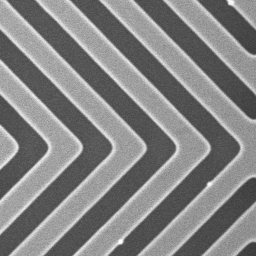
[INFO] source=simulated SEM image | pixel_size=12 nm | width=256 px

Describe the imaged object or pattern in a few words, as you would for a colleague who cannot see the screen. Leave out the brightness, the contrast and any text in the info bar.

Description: groups of lines, slits or small figures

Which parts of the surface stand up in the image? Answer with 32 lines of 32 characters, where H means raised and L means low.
HLLLLHHHHLLLLHHHHLLLLHHHHLLLLHHH
HHLLLLHHHHLLLLHHHHLLLLHHHHLLLLHH
HHHLLLLHHHHLLLLHHHHLLLLHHHHLLLLH
HHHHLLLLHHHHLLLLHHHHLLLLHHHHLLLL
LHHHHLLLLHHHHLLLLHHHHLLLLHHHHLLL
LLHHHHLLLLHHHHLLLLHHHHLLLLHHHHLL
LLLHHHHLLLLHHHHLLLLHHHHLLLLHHHHL
LLLLHHHHLLLLHHHHLLLLHHHHLLLLHHHH
HLLLLHHHHLLLLHHHHLLLLHHHHLLLLHHH
HHLLLLHHHHLLLLHHHHLLLLHHHHLLLLHH
HHHLLLLHHHHLLLLHHHHLLLLHHHHLLLLH
HHHHLLLLHHHHLLLLHHHHLLLLHHHHLLLL
LHHHHLLLLHHHHLLLLHHHHLLLLHHHHLLL
LLHHHHLLLLHHHHLLLLHHHHLLLLHHHHLL
LLLHHHHLLLLHHHHLLLLHHHHLLLLHHHHL
LLLLHHHHLLLLHHHHLLLLHHHHLLLLHHHH
HLLLLHHHHLLLLHHHHLLLLHHHHLLLHHHH
HHLLLLHHHHLLLLHHHHLLLLHHHHLLLLHH
HHLLLLHHHHLLLLHHHHLLLLHHHHLLLLHH
HHLLLLHHHHLLLLHHHHLLLLHHHHLLLLHH
HLLLLHHHHLLLLHHHHLLLLHHHHLLLLHHH
LLLLHHHHLLLLHHHHLLLLHHHHLLLLHHHH
LLLHHHHLLLLHHHHLLLLHHHHLLLLHHHHL
LLHHHHLLLLHHHHLLLLHHHHLLLLHHHHLL
LHHHHLLLLHHHHLLLLHHHHLLLLHHHHLLL
HHHHLLLLHHHHLLLLHHHHLLLLHHHHLLLL
HHHLLLLHHHHLLLLHHHHLLLLHHHHLLLLH
HHLLLLHHHHLLLLHHHHLLLLHHHHLLLLHH
HLLLLHHHHLLLLHHHHLLLLHHHHLLLLHHH
LLLLHHHHLLLLHHHHLLLLHHHHLLLLHHHH
LLLHHHHLLLLHHHHLLLLHHHHLLLLHHHHL
LLHHHHLLLLHHHHLLLLHHHHLLLLHHHHLL